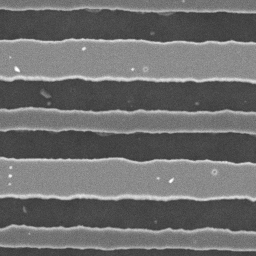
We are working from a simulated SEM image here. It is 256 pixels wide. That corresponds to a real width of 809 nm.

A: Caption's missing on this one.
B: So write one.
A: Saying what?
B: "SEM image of lines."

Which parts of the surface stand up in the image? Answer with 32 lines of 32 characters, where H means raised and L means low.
HHHHHHHHHHHHHHHHHHHHHHHHHHHHHHHH
LLLLLLLLLLLLLLLLLLLLLLLLLLLLLHHH
LLLLLLLLLLLLLLLLLLLLLLLLLLLLLLLL
LLLLLLLLLLLLLLLLLLLLLLLLLLLLLLLL
LLLLLLLLLLLLLLLLLLLLLLLLLLLLLLLL
HHHHHHHHHHHHHHHHHHHHHHHHHHHHHHHH
HHHHHHHHHHHHHHHHHHHHHHHHHHHHHHHH
HHHHHHHHHHHHHHHHHHHHHHHHHHHHHHHH
HHHHHHHHHHHHHHHHHHHHHHHHHHHHHHHH
HHHHHHHHHHHHHHHHHHHHHHHHHHHHHHHH
LLLLLLLLLLLLLLLLLLLLLLLLLLLLLLLL
LLLLLLLLLLLLLLLLLLLLLLLLLLLLLLLL
LLLLLLLLLLLLLLLLLLLLLLLLLLLLLLLL
LLLHHLLLLLLLLLLLLLLLLLLLLLLLLLLL
HHHHHHHHHHHHHHHHHHHHHHHHHHHHHHHH
HHHHHHHHHHHHHHHHHHHHHHHHHHHHHHHH
LLLLLLLLLLLLHHHHHHHHHHHHHHHHHHHH
LLLLLLLLLLLLLLLLLLLLLLLLLLLLLLLL
LLLLLLLLLLLLLLLLLLLLLLLLLLLLLLLL
LLLLLLLLLLLLLLLLLLLLLLLLLLLLLLLL
HHHHHHHHHHHHHHHHHHHHHHHHHHHHHHHH
HHHHHHHHHHHHHHHHHHHHHHHHHHHHHHHH
HHHHHHHHHHHHHHHHHHHHHHHHHHHHHHHH
HHHHHHHHHHHHHHHHHHHHHHHHHHHHHHHH
HHHHHHHHHHHHHHHHHHHHHHHHHHHHHHHH
LLLLLLLLLLLLLLLLLLLLLLLLLLLLLLLL
LLLLLLLLLLLLLLLLLLLLLLLLLLLLLLLL
LLLLLLLLLLLLLLLLLLLLLLLLLLLLLLLL
LHHHHHHHHHHHLHLLLLLLLLLLLLLLLLLL
HHHHHHHHHHHHHHHHHHHHHHHHHHHHHHHH
HHHHHHHHHHHHHHHHHHHHHHHHHHHHHHHH
LLLLLLLLLLLLLLLLLLLLLLLLLLLLLLLL